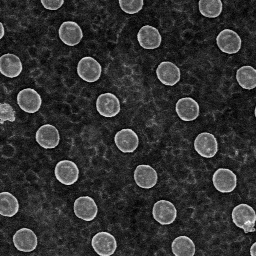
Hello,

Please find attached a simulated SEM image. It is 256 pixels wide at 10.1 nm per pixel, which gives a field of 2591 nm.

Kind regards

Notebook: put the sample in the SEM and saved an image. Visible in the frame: a regular array of raised bodies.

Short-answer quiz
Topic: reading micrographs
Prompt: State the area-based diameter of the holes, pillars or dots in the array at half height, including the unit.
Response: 233 nm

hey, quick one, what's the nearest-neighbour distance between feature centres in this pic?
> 409 nanometers